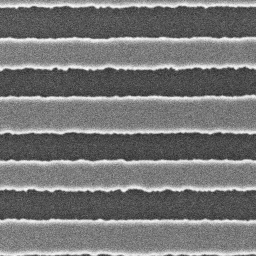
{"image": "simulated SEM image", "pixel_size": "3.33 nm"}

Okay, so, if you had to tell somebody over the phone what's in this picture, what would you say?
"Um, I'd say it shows lines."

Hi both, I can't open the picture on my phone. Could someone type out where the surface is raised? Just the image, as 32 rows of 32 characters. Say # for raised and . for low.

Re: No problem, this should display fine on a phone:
################################
................................
................................
................................
................................
################################
################################
################################
###.#########.##########.#.#.#.#
................................
................................
................................
################################
################################
################################
################################
######################...#######
................................
................................
................................
################################
################################
################################
################################
................................
................................
................................
.##...##........................
################################
################################
################################
################################